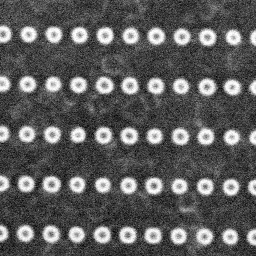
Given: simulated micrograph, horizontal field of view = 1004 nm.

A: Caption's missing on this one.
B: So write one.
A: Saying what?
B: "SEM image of a regular array of raised bodies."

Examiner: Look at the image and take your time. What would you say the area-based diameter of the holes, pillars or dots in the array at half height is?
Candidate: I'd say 0.0553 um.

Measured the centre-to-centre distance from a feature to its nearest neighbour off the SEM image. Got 0.0996 microns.